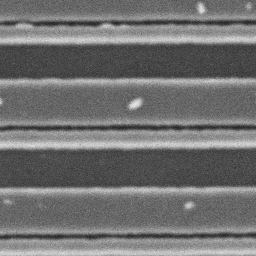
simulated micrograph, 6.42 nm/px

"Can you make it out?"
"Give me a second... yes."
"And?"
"lines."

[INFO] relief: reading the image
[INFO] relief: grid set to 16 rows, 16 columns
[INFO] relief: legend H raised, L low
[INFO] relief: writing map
HHHHHHHHHHHHHHHH
HHHHHHHHHHHHHHHH
HHHHHHHHHHHHHHHH
LLLLLLLLLLLLLLLL
LLLLLLLLLLLLLLLL
HHHHHHHHHHHHHHHH
HHHHHHHHHHHHHHHH
HHHHHHHHHHHHHHHH
HHHHHHHHHHHHHHHH
LLLLLLLLLLLLLLLL
LLLLLLLLLLLLLLLL
LLLLLLLLLLLLLLLL
HHHHHHHHHHHHHHHH
HHHHHHHHHHHHHHHH
HHHHHHHHHHHHHHHH
HHHHHHHHHHHHHHHH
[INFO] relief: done